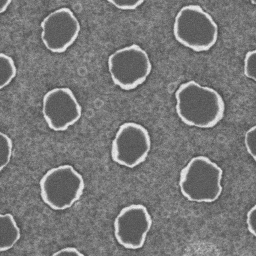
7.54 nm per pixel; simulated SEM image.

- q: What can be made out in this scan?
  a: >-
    a regular array of raised bodies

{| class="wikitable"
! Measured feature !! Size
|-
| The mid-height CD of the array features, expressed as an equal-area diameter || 302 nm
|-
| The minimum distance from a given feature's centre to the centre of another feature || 590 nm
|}